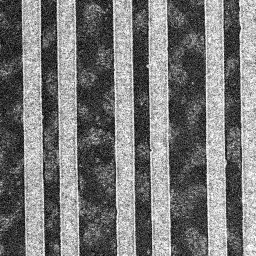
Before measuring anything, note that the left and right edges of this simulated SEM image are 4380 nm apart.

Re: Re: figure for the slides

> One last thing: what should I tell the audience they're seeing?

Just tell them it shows parallel lines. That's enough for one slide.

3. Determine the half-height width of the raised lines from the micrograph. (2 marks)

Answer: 0.289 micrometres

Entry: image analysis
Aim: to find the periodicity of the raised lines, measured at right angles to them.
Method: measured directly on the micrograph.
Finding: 781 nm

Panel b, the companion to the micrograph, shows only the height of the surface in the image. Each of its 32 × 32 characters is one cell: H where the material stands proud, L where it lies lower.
LLLHHLLHHLLLLLHHLLLHHLLLLLHHLLHH
LLLHHLLHHLLLLLHHLLLHHLLLLLHHLLHH
LLLHHLLHHLLLLLHHLLLHHLLLLLHHLLHH
LLLHHLLHHLLLLLHHLLLHHLLLLLHHLLHH
LLLHHLLHHLLLLLHHLLLHHLLLLLHHLLHH
LLLHHLLHHLLLLLHHLLLHHLLLLLHHLLHH
LLLHHLLHHLLLLLHHLLLHHLLLLLHHLLHH
LLLHHLLHHLLLLLHHLLLHHLLLLLHHLLHH
LLLHHLLHHLLLLLHHHLLHHLLLLLHHLLHH
LLLHHLLHHLLLLLHHHLLHHLLLLLHHLLHH
LLLHHLLHHLLLLLHHHLLHHLLLLLHHLLHH
LLLHHLLHHLLLLLHHHLLHHLLLLLHHLLHH
LLLHHLLHHLLLLLHHHLLHHLLLLLHHLLHH
LLLHHLLHHLLLLLHHHLLHHLLLLLHHLLHH
LLLHHLLHHLLLLLLHHLLHHLLLLLHHLLHH
LLLHHLLHHLLLLLLHHLLHHLLLLLHHLLHH
LLLHHLLHHLLLLLLHHLLHHLLLLLHHLLHH
LLLHHLLHHLLLLLLHHLLHHLLLLLHHLLHH
LLLHHLLHHLLLLLLHHLLHHLLLLLHHLLHH
LLLHHLLLHHLLLLLHHLLHHLLLLLHHLLHH
LLLHHLLLHHLLLLLHHLLHHLLLLLHHLLHH
LLLHHLLLHHLLLLLHHLLHHLLLLLHHLLHH
LLLHHLLLHHLLLLLHHLLHHLLLLLHHLLHH
LLLHHLLLHHLLLLLHHLLHHLLLLLHHLLHH
LLLHHLLLHHLLLLLHHLLHHLLLLLHHLLLH
LLLHHLLLHHLLLLLHHLLHHLLLLLHHLLLH
LLLHHLLLHHLLLLLHHLLHHLLLLLHHLLHH
LLLHHLLLHHLLLLLHHLLHHLLLLLHHLLHH
LLLHHLLLHHLLLLLHHLLHHLLLLLHHLLHH
LLLHHLLLHHLLLLLHHLLHHLLLLLHHLLHH
LLLHHLLLHHLLLLLHHLLHHLLLLLHHLLHH
LLLHHLLLHHLLLLLHHLLHHLLLLLHHLLLH